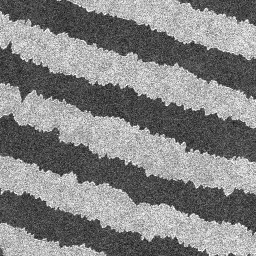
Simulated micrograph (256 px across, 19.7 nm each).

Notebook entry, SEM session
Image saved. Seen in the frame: one or a few lines or trenches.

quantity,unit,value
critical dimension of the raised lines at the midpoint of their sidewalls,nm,626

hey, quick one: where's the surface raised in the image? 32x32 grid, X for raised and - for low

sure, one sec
----------XXXXXXXXXXXXX---------
------------XXXXXXXXXXXXXXX-----
X----------------XXXXXXXXXXXX---
XXXXX--------------XXXXXXXXXXXXX
XXXXXXXXX-------------XXXXXXXXXX
XXXXXXXXXXX--------------XXXXXXX
--XXXXXXXXXXXX---------------XXX
----XXXXXXXXXXXXX---------------
------XXXXXXXXXXXXXXXXX---------
----------XXXXXXXXXXXXXX--------
---------------XXXXXXXXXXXX-----
XX---------------XXXXXXXXXXXXX--
XXXXXXX-------------XXXXXXXXXXXX
XXXXXXXXXX-------------XXXXXXXXX
--XXXXXXXXXX---------------XXXXX
--XXXXXXXXXXXXXX---------------X
-------XXXXXXXXXXXX-------------
--------XXXXXXXXXXXXXX----------
-----------XXXXXXXXXXXX---------
-------------XXXXXXXXXXXXXX-----
XXX--------------XXXXXXXXXXXXXXX
XXXXXX------------XXXXXXXXXXXXXX
XXXXXXXXXX-------------XXXXXXXXX
XXXXXXXXXXXXXX--------------XXXX
----XXXXXXXXXXXX----------------
------XXXXXXXXXXX---------------
---------XXXXXXXXXXXXX----------
------------XXXXXXXXXXXXX-------
XX------------XXXXXXXXXXXXXXXXX-
XXXX--------------X-XXXXXXXXXXXX
XXXXXXX----------------XXXXXXXXX
XXXXXXXXXXXX--------------XXXXXX